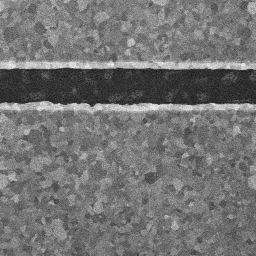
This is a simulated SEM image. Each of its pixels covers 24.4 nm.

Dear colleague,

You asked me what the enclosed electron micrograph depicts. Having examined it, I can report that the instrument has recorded one or a few lines or trenches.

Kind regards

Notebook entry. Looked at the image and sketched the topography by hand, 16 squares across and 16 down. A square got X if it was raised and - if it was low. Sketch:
XXXXXXXXXXXXXXXX
XXXXXXXXXXXXXXXX
XXXXXXXXXXXXXXXX
XXXXXXXXXXXXXXXX
----------------
----------------
----------------
XXXXXXXXXXXXXXXX
XXXXXXXXXXXXXXXX
XXXXXXXXXXXXXXXX
XXXXXXXXXXXXXXXX
XXXXXXXXXXXXXXXX
XXXXXXXXXXXXXXXX
XXXXXXXXXXXXXXXX
XXXXXXXXXXXXXXXX
XXXXXXXXXXXXXXXX